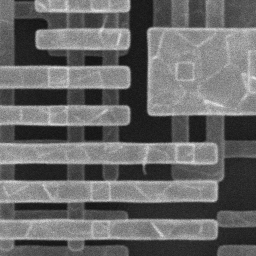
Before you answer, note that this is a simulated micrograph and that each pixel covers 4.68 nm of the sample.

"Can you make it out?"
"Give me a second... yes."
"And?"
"wiring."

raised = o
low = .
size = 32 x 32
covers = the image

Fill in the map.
oo..oooooooooooo......o...oo....
oo......ooo.ooo......oo...oo....
oo......oo...oo......oo...oo....
oo......ooo.ooo......ooo.ooo....
oo...ooooooooooo..oooooooooooooo
oo...ooooooooooo..oooooooooooooo
oo......ooo..oo....ooooooooooooo
oo......ooo..oo....ooooooooooooo
oooooooooooooooo..oooooooooooooo
oooooooooooooooo..oooooooooooooo
oooooooooooooooo..oooooooooooooo
oo......ooo..oo...oooooooooooooo
oo......ooo..oo...oooooooooooooo
oooooooooooooooo..oooooooooooooo
oooooooooooooooo.....ooo.ooo....
oooooooooooooooo......oo..oo....
oo.......oo..oo.......oo..oo....
oo.......oo..oo......ooo..oo....
oooooooooooooooooooooooooooo....
oooooooooooooooooooooooooooo....
oo......ooo.ooo..oo..ooooooo....
oo.......oo..oo......ooooooo....
oo......ooo..oo......ooooooo....
ooooooooooooooooooooooooooo.....
ooooooooooooooooooooooooooo.....
oo......ooo.....................
oo.......oo.....................
oo....ooooo.....ooooo...........
ooooooooooooooooooooooooooo.....
ooooooooooooooooooooooooooo.....
oo.......oo.....................
................................